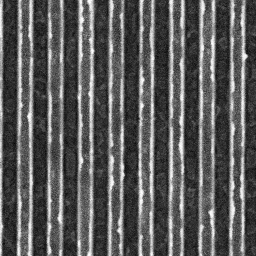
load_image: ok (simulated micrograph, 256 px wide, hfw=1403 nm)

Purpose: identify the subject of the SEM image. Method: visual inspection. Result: parallel lines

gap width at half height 91.8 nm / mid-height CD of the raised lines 14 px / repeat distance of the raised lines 166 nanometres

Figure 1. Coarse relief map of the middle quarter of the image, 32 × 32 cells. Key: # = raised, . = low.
....###.....###....###.....###..
....###.....###....###.....###..
....###.....###....###.....###..
....###.....###....###.....###..
....###.....###....###.....###..
....###.....###....###.....###..
....###....####....###.....###..
....###....####....###.....###..
....###....###.....###.....###..
....###....###.....###.....###..
....###....###.....###.....###..
....###....###.....###.....###..
....###....###.....###.....###..
....###....###.....###.....###..
....###....###.....###.....###..
....###....####....###.....###..
....###....####....###.....###..
....###....####....###.....###..
....###....####....###.....###..
....###....####....###.....###..
....###....####....###.....###..
....###....####....###.....###..
....###....###.....###.....###..
....###....###.....###.....###..
....###....####....###.....###..
....###....####....###.....###..
....###....####....###.....###..
....###....####....###.....###..
....###....####....###.....###..
....###....###.....###.....###..
....###....###.....###.....###..
....###....###.....###.....###..